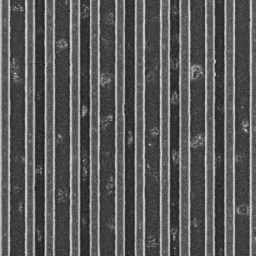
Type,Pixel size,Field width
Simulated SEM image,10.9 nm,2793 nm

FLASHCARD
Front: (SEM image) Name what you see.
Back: parallel lines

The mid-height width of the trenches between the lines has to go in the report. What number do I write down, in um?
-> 0.172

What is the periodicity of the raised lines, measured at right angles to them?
0.241 micrometres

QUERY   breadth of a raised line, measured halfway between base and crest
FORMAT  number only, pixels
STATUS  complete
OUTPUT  8.87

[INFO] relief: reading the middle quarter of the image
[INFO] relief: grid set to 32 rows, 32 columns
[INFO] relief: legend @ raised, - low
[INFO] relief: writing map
--@@---@@----@@---@@----@@---@@-
--@@---@@----@@---@@----@@---@@-
--@@---@@----@@---@@----@@---@@-
--@@---@@----@@---@@----@@---@@-
--@@---@@----@@---@@----@@---@@-
--@@---@@----@@---@@----@@---@@-
--@@---@@----@@---@@----@@---@@-
--@@---@@----@@---@@----@@---@@-
--@@---@@----@@---@@----@@---@@-
--@@---@@----@@---@@----@@---@@-
--@@---@@----@@---@@----@@---@@-
--@@---@@----@@---@@----@@---@@-
--@@---@@----@@---@@----@@---@@-
--@@---@@----@@---@@----@@---@@-
--@@---@@----@@---@@----@@---@@-
--@@---@@----@@---@@----@@---@@-
--@@---@@----@@---@@----@@---@@-
--@@---@@----@@---@@----@@---@@-
--@@---@@----@@---@@----@@---@@-
--@@---@@----@@---@@----@@---@@-
--@@---@@----@@---@@----@@---@@-
--@@---@@----@@---@@----@@---@@-
--@@---@@----@@---@@----@@---@@-
--@@---@@----@@---@@----@@---@@-
--@@---@@----@@---@@----@@---@@-
--@@---@@----@@---@@----@@---@@-
--@@---@@----@@---@@----@@---@@-
--@@---@@----@@---@@----@@---@@-
--@@---@@----@@---@@----@@---@@-
--@@---@@----@@---@@----@@---@@-
--@@---@@----@@---@@----@@---@@-
--@@---@@----@@---@@----@@---@@-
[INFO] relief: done